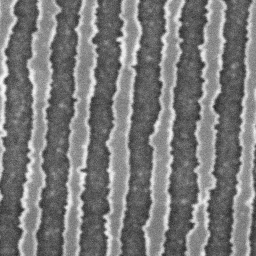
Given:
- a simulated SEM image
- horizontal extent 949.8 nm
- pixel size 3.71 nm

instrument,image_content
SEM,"parallel lines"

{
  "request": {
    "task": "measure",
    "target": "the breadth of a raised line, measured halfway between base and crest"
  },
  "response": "0.0587 µm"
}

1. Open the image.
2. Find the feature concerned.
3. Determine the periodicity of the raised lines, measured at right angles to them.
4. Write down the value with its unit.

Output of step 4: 156 nanometers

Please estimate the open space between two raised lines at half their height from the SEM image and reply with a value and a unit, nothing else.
26.5 px